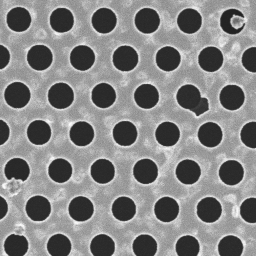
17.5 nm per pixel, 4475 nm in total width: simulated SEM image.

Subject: a regular array of holes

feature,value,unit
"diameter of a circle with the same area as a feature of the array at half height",449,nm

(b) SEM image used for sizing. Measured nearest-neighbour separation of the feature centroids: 746 nm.